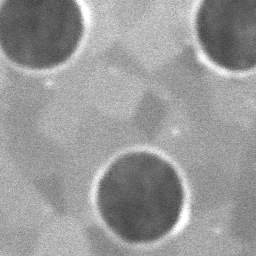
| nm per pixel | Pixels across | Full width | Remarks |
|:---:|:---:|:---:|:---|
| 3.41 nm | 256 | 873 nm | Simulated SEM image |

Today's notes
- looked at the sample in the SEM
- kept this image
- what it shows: holes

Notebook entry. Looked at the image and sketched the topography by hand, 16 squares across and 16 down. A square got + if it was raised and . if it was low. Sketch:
.....+++++++....
.....+++++++....
.....+++++++....
.....++++++++...
++++++++++++++++
++++++++++++++++
++++++++++++++++
++++++++++++++++
++++++++++++++++
++++++++..++++++
+++++++....+++++
++++++.....+++++
++++++......++++
++++++.....+++++
+++++++....+++++
++++++++++++++++